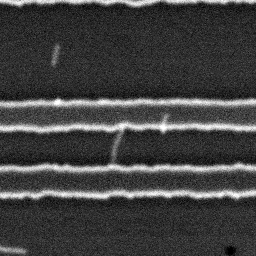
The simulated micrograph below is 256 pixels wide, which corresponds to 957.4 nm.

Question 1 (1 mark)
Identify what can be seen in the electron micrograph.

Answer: lines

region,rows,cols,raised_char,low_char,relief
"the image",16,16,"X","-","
----------------
----------------
----------------
----------------
----------------
----------------
XXXXXXXXXXXXXXXX
XXXXXXXXXXXXXXXX
----------------
----------------
XXXXXXXXXXXXXXXX
XXXXXXXXXXXXXXXX
----------------
----------------
----------------
----------------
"